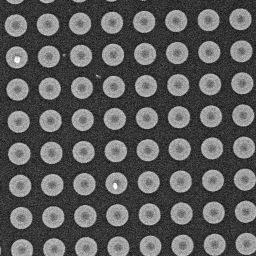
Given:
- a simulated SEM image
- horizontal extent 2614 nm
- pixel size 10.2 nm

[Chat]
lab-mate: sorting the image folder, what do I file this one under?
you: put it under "an array of small figures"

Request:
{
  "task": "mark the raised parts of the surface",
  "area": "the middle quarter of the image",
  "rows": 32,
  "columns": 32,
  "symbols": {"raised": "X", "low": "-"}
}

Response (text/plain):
---XX---------------------------
--------------------------------
--------------------------------
---XX------XXX-----XXX-----XXXX-
--XXXXX---XXXXX---XXXXX---XXXXX-
--XXXXX---XXXXX---XXXXX---XXXXX-
--XXXXX---XXXXX---XXXXX---XXXXX-
--XXXXX---XXXXX----XXX-----XXX--
----X---------------------------
--------------------------------
--------------------------------
----XX-----XXX-----XXX-----XXXX-
--XXXXX---XXXXX---XXXXX---XXXXX-
--XXXXX---XXXXX---XXXXX---XXXXX-
--XXXXX---XXXXX---XXXXX---XXXXX-
--XXXXX----XXXX----XXXX----XXX--
----XX--------------------------
--------------------------------
--------------------------------
----XX------XX-----XXXX----XXXX-
---XXXX----XXXX---XXXXX---XXXXXX
--XXXXX---XXXXXX--XXXXXX--XXXXXX
--XXXXX---XXXXXX--XXXXX---XXXXX-
---XXXX----XXXX----XXXX----XXXX-
----XX--------------------------
--------------------------------
--------------------------------
----XX------XXX----XXXX----XXXX-
---XXXX----XXXX----XXXXX---XXXXX
--XXXXXX--XXXXXX---XXXXX---XXXXX
--XXXXXX---XXXXX---XXXXX---XXXXX
---XXXX----XXXX----XXXX-----XXX-